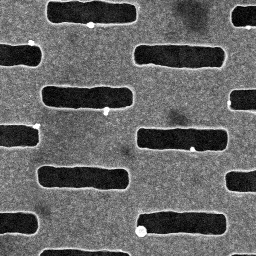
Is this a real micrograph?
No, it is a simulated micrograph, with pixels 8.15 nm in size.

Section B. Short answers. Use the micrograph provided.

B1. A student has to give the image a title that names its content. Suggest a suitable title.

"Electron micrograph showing holes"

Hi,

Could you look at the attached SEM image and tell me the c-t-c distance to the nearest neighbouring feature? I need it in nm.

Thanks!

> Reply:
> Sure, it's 678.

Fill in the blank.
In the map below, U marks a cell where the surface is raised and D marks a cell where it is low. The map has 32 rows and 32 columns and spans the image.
UUUUUUDDDDDDDDDDUUUUUUUUUUUUUUUU
UUUUUUDDDDDDDDDDDUUUUUUUUUUUUDDD
UUUUUUDDDDDDDDDDDUUUUUUUUUUUUDDD
UUUUUUUUUUUUUUUUUUUUUUUUUUUUUUUU
UUUUUUUUUUUUUUUUUUUUUUUUUUUUUUUU
DUUUUUUUUUUUUUUUUUUUUUUUUUUUUUUU
DDDDDUUUUUUUUUUUUDDDDDDDDDDDUUUU
DDDDDUUUUUUUUUUUUDDDDDDDDDDDUUUU
UUUUUUUUUUUUUUUUUUUUUUDUDUUUUUUU
UUUUUUUUUUUUUUUUUUUUUUUUUUUUUUUU
UUUUUUUUUUUUUUUUUUUUUUUUUUUUUUUU
UUUUUDDDDDDDDDDDUUUUUUUUUUUUUDDD
UUUUUDDDDDDDDDDDDUUUUUUUUUUUUDDD
UUUUUUUUUDDDDDDUUUUUUUUUUUUUUDDD
UUUUUUUUUUUUUUUUUUUUUUUUUUUUUUUU
UUUUUUUUUUUUUUUUUUUUUUUUUUUUUUUU
DDDDDUUUUUUUUUUUUDDDDDDDDDDDUUUU
DDDDDUUUUUUUUUUUUDDDDDDDDDDDUUUU
UUUUUUUUUUUUUUUUUUDDDDDDDDDDUUUU
UUUUUUUUUUUUUUUUUUUUUUUUUUUUUUUU
UUUUUUUUUUUUUUUUUUUUUUUUUUUUUUUU
UUUUUDDDDDDDDDDDUUUUUUUUUUUUUDUD
UUUUUDDDDDDDDDDDUUUUUUUUUUUUDDDD
UUUUUUUUUUUUDDDDUUUUUUUUUUUUDDDD
UUUUUUUUUUUUUUUUUUUUUUUUUUUUUUUU
UUUUUUUUUUUUUUUUUUUUUUUUUUUUUUUU
UUUUUUUUUUUUUUUUUUUUDDUDDDUUUUUU
DDDDDUUUUUUUUUUUUDDDDDDDDDDDUUUU
DDDDDUUUUUUUUUUUUUDDDDDDDDDDUUUU
UUUUUUUUUUUUUUUUUUUUUUUUUUUUUUUU
UUUUUUUUUUUUUUUUUUUUUUUUUUUUUUUU
UUUUUDDDDDDDDDDUUUUUUUUUUUUUUUUU